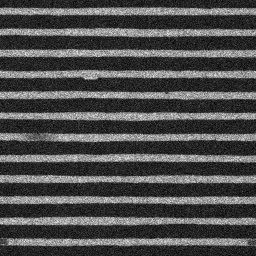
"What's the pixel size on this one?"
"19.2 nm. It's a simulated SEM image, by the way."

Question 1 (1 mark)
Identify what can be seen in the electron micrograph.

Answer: parallel lines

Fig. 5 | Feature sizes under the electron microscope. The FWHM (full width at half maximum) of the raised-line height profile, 6.62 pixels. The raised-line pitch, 404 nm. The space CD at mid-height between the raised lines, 0.272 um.